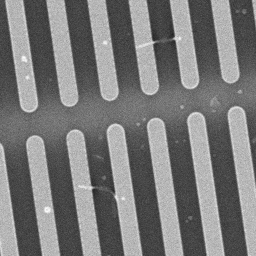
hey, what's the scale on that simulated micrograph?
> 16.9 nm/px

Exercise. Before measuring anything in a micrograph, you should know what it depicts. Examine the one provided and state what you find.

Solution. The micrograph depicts groups of lines, slits or small figures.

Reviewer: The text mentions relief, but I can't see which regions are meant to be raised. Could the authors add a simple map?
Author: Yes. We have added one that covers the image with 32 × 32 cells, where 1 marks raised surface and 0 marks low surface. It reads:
01100011000110001100011000111000
01100011000110001110011100011000
01100011000110001110001100011000
01100011000111000110001100011000
01100001100011000110001100011000
01110001100011000110001100011000
00110001100011000110001100011000
00110001100011000110001110001100
00110001100011000111001110001100
00110001100011000111000110001100
00110001110001100011000110000000
00111000110001100010000000000000
00111000110001000000000000000000
00010000000000000000000000000100
00000000000000000000000010000110
00000000000000000001000111000110
00000000010001110001100011000110
00001000111000110001100011000110
00011100111000110001100011000110
00001100011000110001100011000110
10001100011000110001100011000111
10001100011000110001100011000111
10001100011000110001110001100011
10001100011000111000110001100011
10001100011100111000110001100011
10001100001100011000110001100011
11000110001100011000110001100011
11000110001100011000110001100011
11000110001100011000110001110001
11000110001100011000111000110001
11000110001100011100111000110001
11000110001110001100011000110001